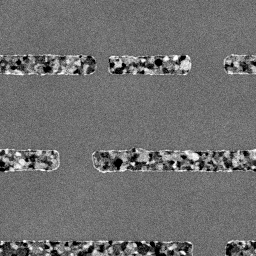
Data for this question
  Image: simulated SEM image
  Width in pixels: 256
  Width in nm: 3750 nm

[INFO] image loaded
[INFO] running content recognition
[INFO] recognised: one or a few lines or trenches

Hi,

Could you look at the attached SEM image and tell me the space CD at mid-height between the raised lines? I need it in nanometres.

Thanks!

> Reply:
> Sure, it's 1080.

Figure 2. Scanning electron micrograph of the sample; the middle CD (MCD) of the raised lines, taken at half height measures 275 nanometres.